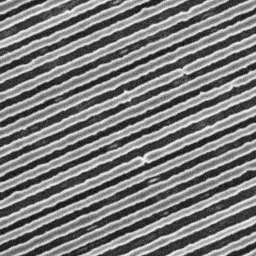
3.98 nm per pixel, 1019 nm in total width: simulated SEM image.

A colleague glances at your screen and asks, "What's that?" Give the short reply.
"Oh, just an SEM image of parallel lines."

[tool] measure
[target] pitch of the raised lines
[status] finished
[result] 65.3 nanometres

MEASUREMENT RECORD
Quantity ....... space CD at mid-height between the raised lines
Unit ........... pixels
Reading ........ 7.99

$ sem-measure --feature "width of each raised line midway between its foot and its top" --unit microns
0.0318